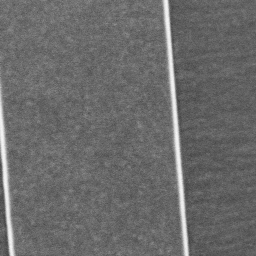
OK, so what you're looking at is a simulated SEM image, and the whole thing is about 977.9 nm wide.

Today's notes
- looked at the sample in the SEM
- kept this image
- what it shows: one or a few lines or trenches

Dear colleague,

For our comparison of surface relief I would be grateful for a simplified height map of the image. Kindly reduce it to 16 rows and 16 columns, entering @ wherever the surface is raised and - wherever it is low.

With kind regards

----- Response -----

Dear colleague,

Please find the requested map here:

@@@@@@@@@@------
@@@@@@@@@@@-----
@@@@@@@@@@@-----
@@@@@@@@@@@-----
@@@@@@@@@@@-----
@@@@@@@@@@@-----
@@@@@@@@@@@-----
@@@@@@@@@@@-----
@@@@@@@@@@@-----
@@@@@@@@@@@-----
@@@@@@@@@@@-----
@@@@@@@@@@@-----
@@@@@@@@@@@-----
@@@@@@@@@@@-----
-@@@@@@@@@@@----
-@@@@@@@@@@@----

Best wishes